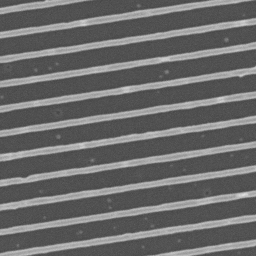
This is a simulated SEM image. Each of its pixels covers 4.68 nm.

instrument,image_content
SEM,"parallel lines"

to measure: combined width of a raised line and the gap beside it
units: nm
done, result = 114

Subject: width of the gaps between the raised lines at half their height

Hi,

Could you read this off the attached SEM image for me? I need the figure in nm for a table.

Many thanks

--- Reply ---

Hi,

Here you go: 82.7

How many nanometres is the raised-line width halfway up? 28.9